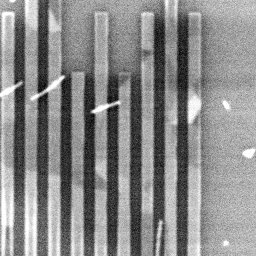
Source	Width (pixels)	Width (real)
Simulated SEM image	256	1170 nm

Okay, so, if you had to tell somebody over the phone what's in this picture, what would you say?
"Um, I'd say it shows groups of lines, slits or small figures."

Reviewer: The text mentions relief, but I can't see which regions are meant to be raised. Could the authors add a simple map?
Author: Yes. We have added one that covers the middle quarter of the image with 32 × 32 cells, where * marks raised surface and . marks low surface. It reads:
........***.........**....**...*
........***.........**....**...*
..***...***...**....**....**...*
..***...***...***...**....**...*
..***...***...**....**....**...*
..***...***...**....**....**...*
..***...***...**....**....**...*
..***...***...**....**....**...*
..***...**....**....**....**...*
..***...**...***....**....**...*
..***...***...**....**....**...*
..***...**....**....**...***...*
..***...**....**....**...***...*
..***...**....**....**...***...*
..***...**....**....**...***...*
..***...**....**....**...***...*
..***...**....**....**...***...*
..***...**....**....**....**...*
..***...**....**....**....**...*
..***...**....**....**....**...*
..***...**....**....**....**...*
..***...**....**....**....**...*
..***...**....**....**....**...*
..***...**....**....**....**...*
..***...**....**....**....**...*
..***...**....**....**...***...*
..***...**....**....**...***...*
..***...**....**....**...***...*
..***...**....**....**...***...*
..***...**....**....**....**...*
..***...**....**....**....**...*
..***...**....**....**....**...*